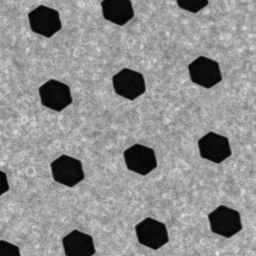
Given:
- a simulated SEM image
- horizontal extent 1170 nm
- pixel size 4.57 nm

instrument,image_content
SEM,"a regular array of holes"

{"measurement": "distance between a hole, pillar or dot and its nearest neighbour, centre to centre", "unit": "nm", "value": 340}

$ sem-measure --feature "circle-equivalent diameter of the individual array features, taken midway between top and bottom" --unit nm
143